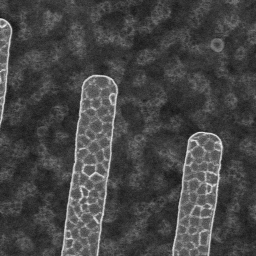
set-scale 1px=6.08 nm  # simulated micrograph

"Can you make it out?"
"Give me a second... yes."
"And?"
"one or a few lines or trenches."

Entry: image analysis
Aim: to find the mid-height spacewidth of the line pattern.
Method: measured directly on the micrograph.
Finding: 0.46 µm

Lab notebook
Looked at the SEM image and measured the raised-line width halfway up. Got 207 nanometres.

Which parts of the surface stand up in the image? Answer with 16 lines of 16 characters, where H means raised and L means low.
LLLLLLLLLLLLLLLL
LLLLLLLLLLLLLLLL
HLLLLLLLLLLLLLLL
HLLLLLLLLLLLLLLL
LLLLLLLLLLLLLLLL
LLLLLHHLLLLLLLLL
LLLLLHHLLLLLLLLL
LLLLLHHLLLLLLLLL
LLLLLHHLLLLLHLLL
LLLLLHHLLLLLHHLL
LLLLLHHLLLLLHHLL
LLLLHHHLLLLHHHLL
LLLLHHHLLLLHHHLL
LLLLHHLLLLLHHLLL
LLLLHHLLLLLHHLLL
LLLLHHLLLLLHHLLL